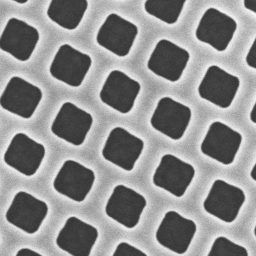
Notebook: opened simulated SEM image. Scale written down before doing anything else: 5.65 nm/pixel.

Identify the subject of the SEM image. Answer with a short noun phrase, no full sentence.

a regular array of holes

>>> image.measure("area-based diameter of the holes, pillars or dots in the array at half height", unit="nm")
220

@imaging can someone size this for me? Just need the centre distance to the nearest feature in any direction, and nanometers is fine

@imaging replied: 318